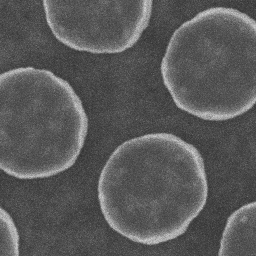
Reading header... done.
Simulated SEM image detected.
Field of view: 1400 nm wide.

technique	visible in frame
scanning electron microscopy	raised bodies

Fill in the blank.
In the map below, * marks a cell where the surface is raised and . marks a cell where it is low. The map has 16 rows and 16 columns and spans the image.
...******.......
...******...****
....****...*****
..........******
.**.......******
****......******
*****......*****
*****...........
*****....*......
*****..*****....
****..******....
......*******...
......*******...
.......*****...*
*......****...**
*.............**